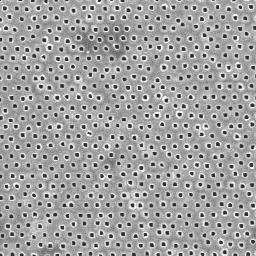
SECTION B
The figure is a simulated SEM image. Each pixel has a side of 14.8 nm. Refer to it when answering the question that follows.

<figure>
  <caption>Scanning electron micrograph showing a regular array of holes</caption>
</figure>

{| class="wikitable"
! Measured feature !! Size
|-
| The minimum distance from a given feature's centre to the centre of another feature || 141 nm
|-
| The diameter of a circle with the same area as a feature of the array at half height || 57.9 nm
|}